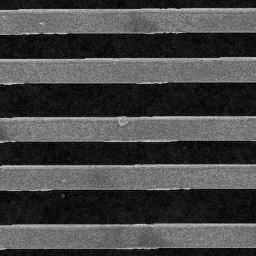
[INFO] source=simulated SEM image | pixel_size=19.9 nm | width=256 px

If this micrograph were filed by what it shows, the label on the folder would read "lines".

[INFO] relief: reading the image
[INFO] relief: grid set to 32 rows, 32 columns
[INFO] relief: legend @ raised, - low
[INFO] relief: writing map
--------------------------------
@@@@@@@@@@@@@@@@@@@@@@@@@@@@@@@@
@@@@@@@@@@@@@@@@@@@@@@@@@@@@@@@@
@@@@@@@@@@@@@@@@@@@@@@@@@@@@@@@@
--------------------------------
--------------------------------
--------------------------------
---------@@@@@@@@@@@@@@@@@@@@@@@
@@@@@@@@@@@@@@@@@@@@@@@@@@@@@@@@
@@@@@@@@@@@@@@@@@@@@@@@@@@@@@@@@
--------------------------------
--------------------------------
--------------------------------
--------------------------------
--------------------------------
@@@@@@@@@@@@@@@@@@@@@@@@@@@@@@@@
@@@@@@@@@@@@@@@@@@@@@@@@@@@@@@@@
@@@@@@@@@@@@@@@@@@@@@@----------
--------------------------------
--------------------------------
--------------------------------
@@@@@@@@@@@@@@@@@@@@@@@@@@@@@@@@
@@@@@@@@@@@@@@@@@@@@@@@@@@@@@@@@
@@@@@@@@@@@@@@@@@@@@@@@@--------
--------------------------------
--------------------------------
--------------------------------
--------------------------------
@@@@@@@@@@@@@@@@@@@@@@@@@@@@@@@@
@@@@@@@@@@@@@@@@@@@@@@@@@@@@@@@@
@@@@@@@@@@@@@@@@@@@@@@@@@@@@@@@@
--------------------------------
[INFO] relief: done